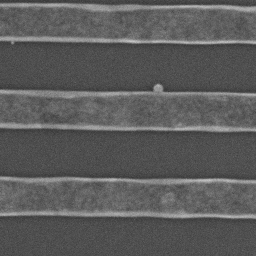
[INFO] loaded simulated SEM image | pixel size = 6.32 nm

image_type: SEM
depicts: wiring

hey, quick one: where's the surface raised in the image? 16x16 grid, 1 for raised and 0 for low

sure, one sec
1111111111111110
1111111111111111
0000001111111111
0000000000000000
0000000000000000
0000000000000000
1111111111111111
1111111111111111
0000000000000000
0000000000000000
0000000000000000
1111111111111111
1111111111111111
0000000000000111
0000000000000000
0000000000000000